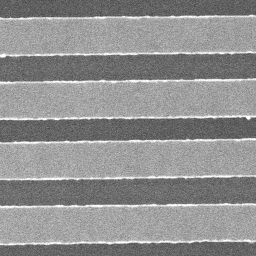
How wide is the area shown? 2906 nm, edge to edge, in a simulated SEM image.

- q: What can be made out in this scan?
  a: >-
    lines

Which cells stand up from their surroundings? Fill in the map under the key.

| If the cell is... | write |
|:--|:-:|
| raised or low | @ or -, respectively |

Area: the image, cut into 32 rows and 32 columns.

--------------------------------
--------------------------------
@@@@@@@@@@@@@@@@@@@@@@@@@@@@@@@@
@@@@@@@@@@@@@@@@@@@@@@@@@@@@@@@@
@@@@@@@@@@@@@@@@@@@@@@@@@@@@@@@@
@@@@@@@@@@@@@@@@@@@@@@@@@@@@@@@@
@@@@@@@@@@@@@@@@@@@@@@@@@@@@@@@@
--------------------------------
--------------------------------
--------------------------------
@@@@@@@@@@@@@@@@@@@@@@@@@@@@@@@@
@@@@@@@@@@@@@@@@@@@@@@@@@@@@@@@@
@@@@@@@@@@@@@@@@@@@@@@@@@@@@@@@@
@@@@@@@@@@@@@@@@@@@@@@@@@@@@@@@@
@@@@@@@@@@@@@@@@@@@@@@@@@@@@@@@@
--------------------------------
--------------------------------
-----------------------@@@@@@@@@
@@@@@@@@@@@@@@@@@@@@@@@@@@@@@@@@
@@@@@@@@@@@@@@@@@@@@@@@@@@@@@@@@
@@@@@@@@@@@@@@@@@@@@@@@@@@@@@@@@
@@@@@@@@@@@@@@@@@@@@@@@@@@@@@@@@
--------------------------------
--------------------------------
--------------------------------
---------------------------@@-@@
@@@@@@@@@@@@@@@@@@@@@@@@@@@@@@@@
@@@@@@@@@@@@@@@@@@@@@@@@@@@@@@@@
@@@@@@@@@@@@@@@@@@@@@@@@@@@@@@@@
@@@@@@@@@@@@@@@@@@@@@@@@@@@@@@@@
@@@-@@--------------------------
--------------------------------